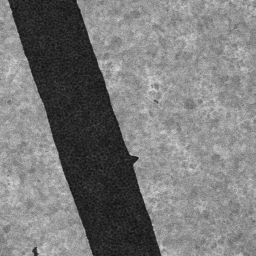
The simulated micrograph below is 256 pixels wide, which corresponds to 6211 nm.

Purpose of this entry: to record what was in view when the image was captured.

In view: one or a few lines or trenches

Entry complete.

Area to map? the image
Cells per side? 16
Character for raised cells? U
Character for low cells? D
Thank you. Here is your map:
UDDDDUUUUUUUUUUU
UDDDDUUUUUUUUUUU
UDDDDDUUUUUUUUUU
UUDDDDUUUUUUUUUU
UUDDDDUUUUUUUUUU
UUDDDDDUUUUUUUUU
UUUDDDDUUUUUUUUU
UUUDDDDUUUUUUUUU
UUUDDDDDUUUUUUUU
UUUUDDDDUUUUUUUU
UUUUDDDDUUUUUUUU
UUUUDDDDDUUUUUUU
UUUUUDDDDUUUUUUU
UUUUUDDDDUUUUUUU
UUUUUDDDDDUUUUUU
UUUUUUDDDDUUUUUU